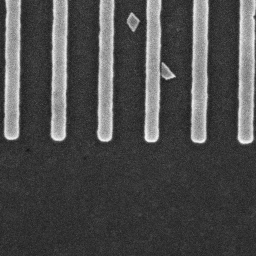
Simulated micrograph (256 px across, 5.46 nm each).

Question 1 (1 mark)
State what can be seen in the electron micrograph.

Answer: parallel lines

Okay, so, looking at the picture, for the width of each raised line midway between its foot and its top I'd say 74.4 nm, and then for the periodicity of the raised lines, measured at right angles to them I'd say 256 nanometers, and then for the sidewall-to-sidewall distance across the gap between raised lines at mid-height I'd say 181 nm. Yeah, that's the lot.